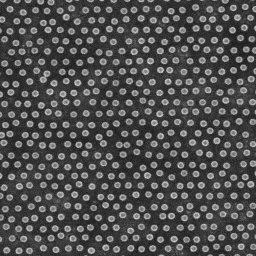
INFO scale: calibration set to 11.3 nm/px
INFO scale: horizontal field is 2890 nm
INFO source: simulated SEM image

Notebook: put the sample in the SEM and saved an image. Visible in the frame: a regular array of raised bodies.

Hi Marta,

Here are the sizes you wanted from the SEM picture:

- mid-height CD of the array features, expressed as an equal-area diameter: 67.4 nanometers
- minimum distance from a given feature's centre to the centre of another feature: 117 nm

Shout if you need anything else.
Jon